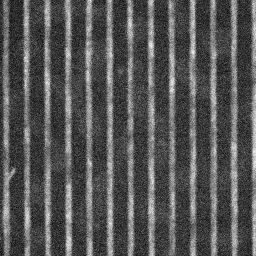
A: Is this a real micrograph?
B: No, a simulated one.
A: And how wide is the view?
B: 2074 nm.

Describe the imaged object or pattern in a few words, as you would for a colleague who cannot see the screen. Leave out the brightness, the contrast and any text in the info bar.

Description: parallel lines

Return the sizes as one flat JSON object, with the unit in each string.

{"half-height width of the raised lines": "35.4 nanometres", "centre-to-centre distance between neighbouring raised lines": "0.168 micrometres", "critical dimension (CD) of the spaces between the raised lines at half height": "133 nm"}